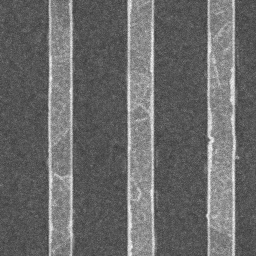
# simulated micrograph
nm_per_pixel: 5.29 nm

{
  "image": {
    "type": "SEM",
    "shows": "one or a few lines or trenches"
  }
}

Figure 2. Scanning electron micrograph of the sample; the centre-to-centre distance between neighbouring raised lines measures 424 nm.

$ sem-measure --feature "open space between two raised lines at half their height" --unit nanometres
303